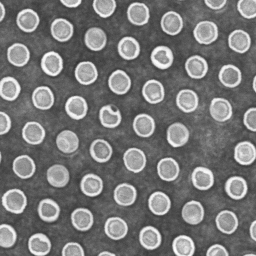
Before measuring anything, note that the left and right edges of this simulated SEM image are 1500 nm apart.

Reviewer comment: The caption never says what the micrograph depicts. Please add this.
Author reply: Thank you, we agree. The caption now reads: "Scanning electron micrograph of a regular array of raised bodies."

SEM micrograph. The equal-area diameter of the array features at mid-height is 133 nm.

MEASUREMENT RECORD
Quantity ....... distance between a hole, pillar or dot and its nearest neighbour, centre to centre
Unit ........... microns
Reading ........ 0.204